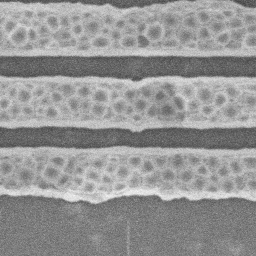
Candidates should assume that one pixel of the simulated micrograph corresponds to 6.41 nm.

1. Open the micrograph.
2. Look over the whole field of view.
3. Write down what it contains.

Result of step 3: one or a few lines or trenches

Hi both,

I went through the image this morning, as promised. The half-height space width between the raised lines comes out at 164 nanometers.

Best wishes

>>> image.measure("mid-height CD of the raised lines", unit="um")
0.289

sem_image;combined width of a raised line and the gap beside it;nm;457